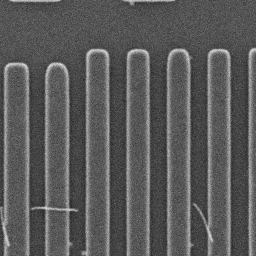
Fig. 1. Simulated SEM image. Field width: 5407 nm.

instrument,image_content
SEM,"wiring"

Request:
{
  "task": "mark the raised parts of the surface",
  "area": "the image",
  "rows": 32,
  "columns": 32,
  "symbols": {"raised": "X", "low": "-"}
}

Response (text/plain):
--------------------------------
--------------------------------
--------------------------------
--------------------------------
--------------------------------
--------------------------------
-----------XX---XX---XX---XX---X
-----------XXX--XXX--XXX--XXX--X
-XX---XX---XXX--XXX--XXX--XXX--X
-XXX--XXX--XXX--XXX--XXX--XXX--X
-XXX--XXX--XXX--XXX--XXX--XXX--X
-XXX--XXX--XXX--XXX--XXX--XXX--X
-XXX--XXX--XXX--XXX--XXX--XXX--X
-XXX--XXX--XXX--XXX--XXX--XXX--X
-XXX--XXX--XXX--XXX--XXX--XXX--X
-XXX--XXX--XXX--XXX--XXX--XXX--X
-XXX--XXX--XXX--XXX--XXX--XXX--X
-XXX--XXX--XXX--XXX--XXX--XXX--X
-XXX--XXX--XXX--XXX--XXX--XXX--X
-XXX--XXX--XXX--XXX--XXX--XXX--X
-XXX--XXX--XXX--XXX--XXX--XXX--X
-XXX--XXX--XXX--XXX--XXX--XXX--X
-XXX--XXX--XXX--XXX--XXX--XXX--X
-XXX--XXX--XXX--XXX--XXX--XXX--X
-XXX--XXX--XXX--XXX--XXX--XXX--X
-XXX--XXX--XXX--XXX--XXX--XXX--X
-XXX--XXX--XXX--XXX--XXX--XXX--X
-XXX--XXX--XXX--XXX--XXX--XXX--X
XXXX--XXX--XXX--XXX--XXX--XXX--X
-XXX--XXX--XXX--XXX--XXX--XXX--X
-XXX--XXX--XXX--XXX--XXX--XXX--X
-XXX--XXX--XXX--XXX--XXX--XXX--X